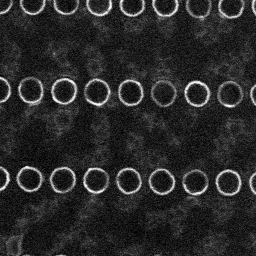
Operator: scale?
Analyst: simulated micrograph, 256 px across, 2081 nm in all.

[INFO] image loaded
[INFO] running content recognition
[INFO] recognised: a regular array of raised bodies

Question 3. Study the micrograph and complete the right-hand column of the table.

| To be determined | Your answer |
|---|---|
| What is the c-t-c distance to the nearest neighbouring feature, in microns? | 0.268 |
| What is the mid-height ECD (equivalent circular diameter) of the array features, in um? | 0.205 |